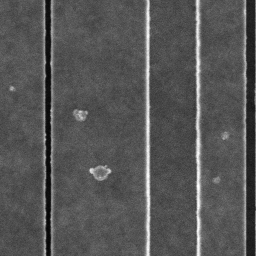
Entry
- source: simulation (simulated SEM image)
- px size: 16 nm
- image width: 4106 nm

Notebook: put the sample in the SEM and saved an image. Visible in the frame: lines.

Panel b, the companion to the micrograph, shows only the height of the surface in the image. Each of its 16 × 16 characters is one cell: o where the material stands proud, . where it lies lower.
ooooooooo...ooo.
ooooooooo...ooo.
ooooooooo...ooo.
ooooooooo...ooo.
ooooooooo...ooo.
ooooooooo...ooo.
ooooooooo...ooo.
ooooooooo...ooo.
ooooooooo...ooo.
ooooooooo...ooo.
ooooooooo...ooo.
ooooooooo...ooo.
ooooooooo...ooo.
ooooooooo...ooo.
ooooooooo...ooo.
ooooooooo...ooo.